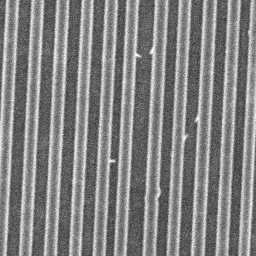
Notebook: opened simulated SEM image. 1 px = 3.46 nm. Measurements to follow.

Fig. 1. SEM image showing parallel lines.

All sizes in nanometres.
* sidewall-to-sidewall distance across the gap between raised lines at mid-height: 42.3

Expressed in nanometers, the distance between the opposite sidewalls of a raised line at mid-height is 41.9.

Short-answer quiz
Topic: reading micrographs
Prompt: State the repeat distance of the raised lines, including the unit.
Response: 84.6 nanometers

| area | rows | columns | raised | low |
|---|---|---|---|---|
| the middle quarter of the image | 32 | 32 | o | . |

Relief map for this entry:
....oo....oo...ooo....ooo...ooo.
....oo....oo...ooo....ooo...ooo.
....oo....oo...ooo....ooo...ooo.
....oo....oo...ooo....ooo...ooo.
....oo....oo...ooo....ooo...ooo.
....oo...ooo...oo.....ooo...ooo.
....oo...ooo...oo.....ooo...ooo.
....oo...ooo...oo.....ooo...ooo.
...ooo...ooo...oo.....ooo...oo..
...ooo...ooo...oo.....ooo...oo..
...ooo...ooo...oo.....ooo...oo..
...ooo...ooo...oo.....oo....oo..
...ooo...ooo...oo.....oo....oo..
...ooo...ooo..ooo.....oo....oo..
...ooo...ooo..ooo....ooo....oo..
...ooo...ooo..ooo....ooo....oo..
...ooo...ooo..ooo....ooo...ooo..
...ooo...oo...ooo....ooo...ooo..
...ooo...oo...ooo....ooo...ooo..
...ooo...oo...ooo....ooo...ooo..
...oo....oo...ooo....ooo...ooo..
...oo....oo...ooo....ooo...ooo..
...oo....oo...ooo....ooo...ooo..
...oo....oo...ooo....ooo...ooo..
...oo....ooo..ooo....ooo...ooo..
...oo....oo...ooo....ooo...oo...
...oo...ooo...oo.....ooo...ooo..
...oo...ooo...oo.....ooo...oo...
..ooo...ooo...oo.....ooo...oo...
..ooo...ooo...oo.....ooo...oo...
..ooo...ooo...oo.....ooo...oo...
..ooo...ooo...oo.....ooo...oo...